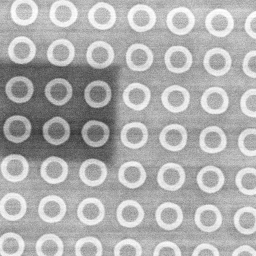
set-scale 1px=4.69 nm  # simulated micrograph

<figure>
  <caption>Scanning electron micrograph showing an array of small figures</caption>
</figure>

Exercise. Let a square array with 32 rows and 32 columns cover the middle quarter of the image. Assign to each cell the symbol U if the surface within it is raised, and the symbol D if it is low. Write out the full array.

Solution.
DDDDDDDUUUUDDDDDUUUUUUDDDDUUUUUU
DDDDDDDDDDDDDDDDDUUUDDDDDDUUUUUD
DDDDDDDDDDDDDDDDDDDDDDDDDDDDDDDD
DDDDDDDDDDDDDDDDDDDDDDDDDDDDDDDD
UDDDDDDUUUDDDDDDDDDDDDDDDDDDDDDD
UUDDDDUUUUUDDDDDUUUUDDDDDDDUUDDD
UUDDDUUUUUUUDDDUUUUUUDDDDUUUUUUD
UUDDDUUUUUUUDDDUUUUUUUDDDUUUUUUD
UUDDDUUUUUUUDDDUUUUUUDDDUUUUUUUD
UDDDDDUUUUUDDDDUUUUUUDDDDUUUUUUD
DDDDDDDUUUDDDDDDUUUUUDDDDUUUUUUD
DDDDDDDDDDDDDDDDDDDDDDDDDDUUUUDD
DDDDDDDDDDDDDDDDDDDDDDDDDDDDDDDD
DDDDDDDDDDDDDDDDDDDDDDDDDDDDDDDD
UDDDDDUUUDDDDDDDDDDDDDDDDDDDDDDD
UDDDDUUUUUUDDDDUUUUUDDDDDDUUUDDD
UDDDUUUUUUUDDDUUUUUUUDDDDUUUUUDD
UDDDUUUUUUUDDDUUUUUUUDDDUUUUUUUD
UDDDDUUUUUUDDDUUUUUUUDDDUUUUUUUD
DDDDDUUUUUDDDDDUUUUUDDDDUUUUUUUD
DDDDDDDUUDDDDDDDUUUDDDDDDUUUUUDD
DDDDDDDDDDDDDDDDDDDDDDDDDDUUUDDD
DDDDDDDDDDDDDDDDDDDDDDDDDDDDDDDD
DDDDDDDDDDDDDDDDDDDDDDDDDDDDDDDD
DDDDDUUUUDDDDDDDUDDDDDDDDDDDDDDD
UDDDUUUUUUDDDDUUUUUDDDDDDUUUUDDD
UDDDUUUUUUUDDDUUUUUUDDDDUUUUUUDD
UDDDUUUUUUUDDDUUUUUUDDDDUUUUUUDD
DDDDUUUUUUDDDDUUUUUUDDDUUUUUUUDD
DDDDDUUUUUDDDDUUUUUUDDDDUUUUUUDD
DDDDDDDDDDDDDDDDUUUDDDDDUUUUUDDD
DDDDDDDDDDDDDDDDDDDDDDDDDDDUDDDD